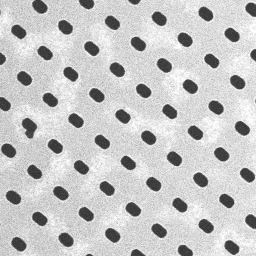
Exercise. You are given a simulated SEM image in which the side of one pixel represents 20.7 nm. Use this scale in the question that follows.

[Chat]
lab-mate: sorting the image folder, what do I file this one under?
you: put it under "a regular array of holes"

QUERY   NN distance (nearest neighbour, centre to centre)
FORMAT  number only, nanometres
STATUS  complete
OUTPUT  680